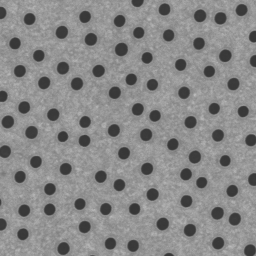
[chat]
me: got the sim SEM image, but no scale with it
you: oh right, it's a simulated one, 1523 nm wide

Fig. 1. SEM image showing a regular array of holes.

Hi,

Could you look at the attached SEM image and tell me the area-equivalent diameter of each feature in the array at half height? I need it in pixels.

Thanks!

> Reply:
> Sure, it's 11.9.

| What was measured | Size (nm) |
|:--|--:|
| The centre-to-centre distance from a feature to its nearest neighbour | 140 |